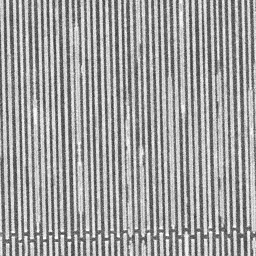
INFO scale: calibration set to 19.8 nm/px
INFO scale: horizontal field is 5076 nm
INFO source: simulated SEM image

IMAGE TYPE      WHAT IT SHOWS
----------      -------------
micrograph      parallel lines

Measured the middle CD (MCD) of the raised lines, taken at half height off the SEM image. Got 0.057 µm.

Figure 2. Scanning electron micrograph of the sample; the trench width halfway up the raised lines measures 3.87 pixels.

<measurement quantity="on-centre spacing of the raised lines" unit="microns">0.122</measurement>